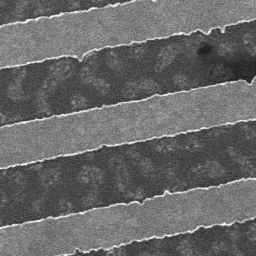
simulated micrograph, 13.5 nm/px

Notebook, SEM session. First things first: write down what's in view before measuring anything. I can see one or a few lines or trenches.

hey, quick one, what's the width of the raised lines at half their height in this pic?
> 549 nanometres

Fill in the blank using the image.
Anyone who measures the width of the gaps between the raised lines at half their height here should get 783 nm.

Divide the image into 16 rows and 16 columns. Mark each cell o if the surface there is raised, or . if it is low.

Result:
......oooooooooo
.oooooooooooooo.
ooooooooo.......
ooooo...........
................
............oooo
.......ooooooooo
..oooooooooooooo
ooooooooooo.....
ooooo...........
................
..............oo
.........ooooooo
....oooooooooooo
oooooooooooo....
ooooooo.........